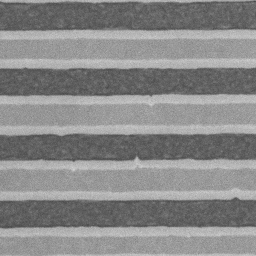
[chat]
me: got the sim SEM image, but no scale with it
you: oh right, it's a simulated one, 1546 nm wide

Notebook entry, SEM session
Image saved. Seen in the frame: one or a few lines or trenches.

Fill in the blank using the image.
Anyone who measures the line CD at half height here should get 177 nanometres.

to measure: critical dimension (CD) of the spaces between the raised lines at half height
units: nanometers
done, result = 221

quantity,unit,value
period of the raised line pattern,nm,395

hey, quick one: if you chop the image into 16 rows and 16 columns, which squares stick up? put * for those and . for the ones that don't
................
................
****************
****************
................
................
****************
****************
................
................
****************
****************
................
................
......*..***.***
****************